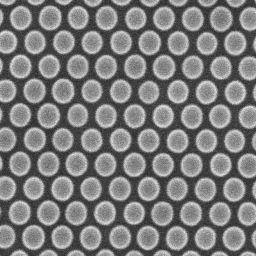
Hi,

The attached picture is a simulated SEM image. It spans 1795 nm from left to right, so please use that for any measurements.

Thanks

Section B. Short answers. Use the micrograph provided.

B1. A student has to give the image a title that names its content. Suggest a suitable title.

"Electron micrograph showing a regular array of raised bodies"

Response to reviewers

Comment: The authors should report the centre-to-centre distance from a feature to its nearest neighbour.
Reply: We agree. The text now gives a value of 196 nm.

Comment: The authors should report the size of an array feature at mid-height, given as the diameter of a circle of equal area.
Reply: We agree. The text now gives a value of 150 nm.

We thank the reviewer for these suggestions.